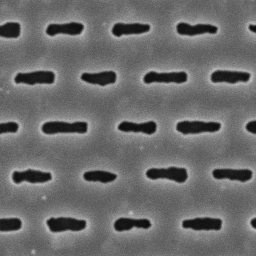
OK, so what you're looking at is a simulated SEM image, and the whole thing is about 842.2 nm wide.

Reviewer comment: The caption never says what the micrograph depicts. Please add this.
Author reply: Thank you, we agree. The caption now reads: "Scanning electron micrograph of a regular array of holes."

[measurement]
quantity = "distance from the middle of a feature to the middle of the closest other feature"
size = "188 nanometers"